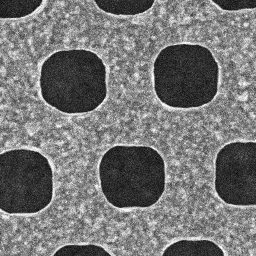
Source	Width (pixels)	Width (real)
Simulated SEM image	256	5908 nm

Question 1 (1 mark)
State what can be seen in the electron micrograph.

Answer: holes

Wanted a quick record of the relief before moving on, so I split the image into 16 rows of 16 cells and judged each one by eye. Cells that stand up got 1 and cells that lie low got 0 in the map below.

0011110001111100
1111111111111111
1111111111111111
1110001111000111
1110000111000011
1110000111000011
1110001111000111
1111111111111111
1111111111111111
0011111000111100
0001110000111000
0001110000111000
0001111000111100
1111111111111111
1111111111111111
1111001111000011